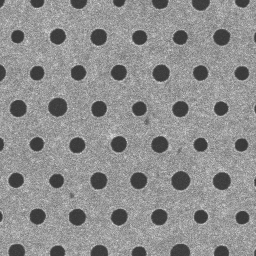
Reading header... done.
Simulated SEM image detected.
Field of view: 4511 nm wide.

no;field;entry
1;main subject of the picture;a regular array of holes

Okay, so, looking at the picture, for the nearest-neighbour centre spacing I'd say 712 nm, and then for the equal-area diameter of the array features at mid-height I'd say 284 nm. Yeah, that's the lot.